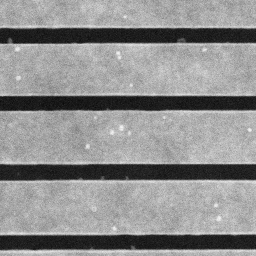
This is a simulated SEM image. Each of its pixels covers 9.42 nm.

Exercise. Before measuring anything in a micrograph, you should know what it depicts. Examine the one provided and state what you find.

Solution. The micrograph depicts lines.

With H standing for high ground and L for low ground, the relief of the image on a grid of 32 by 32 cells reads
HHHHHHHHHHHHHHHHHHHHHHHHHHHHHHHH
HHHHHHHHHHHHHHHHHHHHHHHHHHHHHHHH
HHHHHHHHHHHHHHHHHHHHHHHHHHHHHHHH
LLLLLLLLLLLLLLLLLLLLLLLLLLLLLLLL
LLLLLLLLLLLLLLLLLLLLLLLLLLLLLLLL
LLLLLLLLLHHHHHHHHHHHHHHHHHHHHHHH
HHHHHHHHHHHHHHHHHHHHHHHHHHHHHHHH
HHHHHHHHHHHHHHHHHHHHHHHHHHHHHHHH
HHHHHHHHHHHHHHHHHHHHHHHHHHHHHHHH
HHHHHHHHHHHHHHHHHHHHHHHHHHHHHHHH
HHHHHHHHHHHHHHHHHHHHHHHHHHHHHHHH
HHHHHHHHHHHHHHHHHHHHHHHHHHHHHHHH
LLLLLLLLLLLLLLLLLLLLLLLLLLLLLLLL
LLLLLLLLLLLLLLLLLLLLLLLLLLLLLLLL
HHHHHHHHHHHHHHHHHHHHHHHHHHHHHHHH
HHHHHHHHHHHHHHHHHHHHHHHHHHHHHHHH
HHHHHHHHHHHHHHHHHHHHHHHHHHHHHHHH
HHHHHHHHHHHHHHHHHHHHHHHHHHHHHHHH
HHHHHHHHHHHHHHHHHHHHHHHHHHHHHHHH
HHHHHHHHHHHHHHHHHHHHHHHHHHHHHHHH
LLLHHLHHHHHLLLLLLLLLLLLLLLLLLLLL
LLLLLLLLLLLLLLLLLLLLLLLLLLLLLLLL
LLLLLLLLLLLLLLLLLLLLLLLLLLLLLLLL
HHHHHHHHHHHHHHHHHHHHHHHHHHHHHHHH
HHHHHHHHHHHHHHHHHHHHHHHHHHHHHHHH
HHHHHHHHHHHHHHHHHHHHHHHHHHHHHHHH
HHHHHHHHHHHHHHHHHHHHHHHHHHHHHHHH
HHHHHHHHHHHHHHHHHHHHHHHHHHHHHHHH
HHHHHHHHHHHHHHHHHHHHHHHHHHHHHHHH
LLLLLLLLLLLLLLLLLLLLLLLLLLLLLLLL
LLLLLLLLLLLLLLLLLLLLLLLLLLLLLLLL
HHHHHHHHHHHHHHHHHHHHHHHHHHHHHHHH